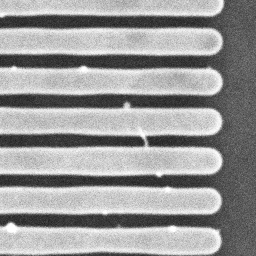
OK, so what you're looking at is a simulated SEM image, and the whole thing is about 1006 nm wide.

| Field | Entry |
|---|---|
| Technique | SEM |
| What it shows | groups of lines, slits or small figures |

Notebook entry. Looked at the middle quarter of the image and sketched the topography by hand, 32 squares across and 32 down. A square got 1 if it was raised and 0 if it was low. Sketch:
00000000000000000000000000000000
11111111000000000000000111111100
11111111111111111111111111111111
11111111111111111111111111111111
11111111111111111111111111111111
11111111111111111111111111111111
11111111111111111111111111111111
00000000000000000000000000000000
00000000000000000000000000000000
00000000000000000000000000000000
00000000000000000000000000000000
11111111111111111111111111111111
11111111111111111111111111111111
11111111111111111111111111111111
11111111111111111111111111111111
11111111111111111111111111111111
11111111111111111111111111111111
00000000011111111111111110000111
00000000000000000000000000000000
00000000000000000000000000000000
00000000000000000000000000000000
11111111111111111111111111111111
11111111111111111111111111111111
11111111111111111111111111111111
11111111111111111111111111111111
11111111111111111111111111111111
11111111111111111111111111111111
00011111111111111111000110000000
00000000000000000000000000000000
00000000000000000000000000000000
00000000000000000000000000000000
11111111111111111111111111111111